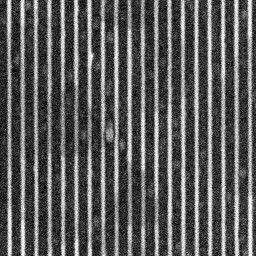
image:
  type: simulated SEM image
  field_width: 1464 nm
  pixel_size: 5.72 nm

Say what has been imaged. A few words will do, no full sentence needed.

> parallel lines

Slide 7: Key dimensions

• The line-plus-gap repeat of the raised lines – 76.5 nm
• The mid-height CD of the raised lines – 0.0143 microns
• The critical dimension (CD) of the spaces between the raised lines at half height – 60 nm